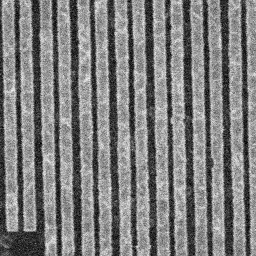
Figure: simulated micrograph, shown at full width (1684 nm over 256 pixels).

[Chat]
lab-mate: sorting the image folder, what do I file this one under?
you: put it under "parallel lines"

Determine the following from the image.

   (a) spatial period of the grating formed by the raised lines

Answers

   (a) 124 nm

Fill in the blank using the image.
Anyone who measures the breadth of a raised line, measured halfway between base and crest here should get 74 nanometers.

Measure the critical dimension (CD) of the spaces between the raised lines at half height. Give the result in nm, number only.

47.7